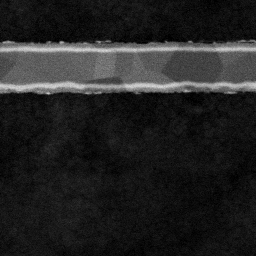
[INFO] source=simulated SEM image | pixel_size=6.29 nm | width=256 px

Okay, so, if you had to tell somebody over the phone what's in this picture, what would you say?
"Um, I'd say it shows one or a few lines or trenches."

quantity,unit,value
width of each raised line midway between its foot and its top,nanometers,228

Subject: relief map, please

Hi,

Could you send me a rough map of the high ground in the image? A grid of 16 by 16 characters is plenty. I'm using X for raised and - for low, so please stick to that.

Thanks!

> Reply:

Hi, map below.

----------------
----------------
----------------
XXXXXXXXXXXXXXXX
XXXXXXXXXXXXXXXX
----------------
----------------
----------------
----------------
----------------
----------------
----------------
----------------
----------------
----------------
----------------